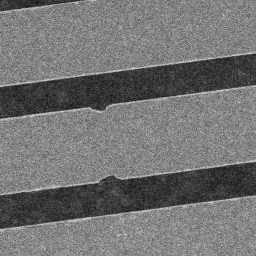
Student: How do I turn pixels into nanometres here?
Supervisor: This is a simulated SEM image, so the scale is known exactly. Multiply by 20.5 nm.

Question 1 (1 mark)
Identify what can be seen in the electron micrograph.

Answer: one or a few lines or trenches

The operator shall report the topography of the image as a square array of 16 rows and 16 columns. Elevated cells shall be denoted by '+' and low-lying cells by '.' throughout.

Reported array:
..++++++++++++++
++++++++++++++++
++++++++++++++++
++++++++++++++..
+++++++.........
...............+
.......+++++++++
++++++++++++++++
++++++++++++++++
++++++++++++++++
+++++++++++++...
+++++...........
..............++
......++++++++++
++++++++++++++++
++++++++++++++++